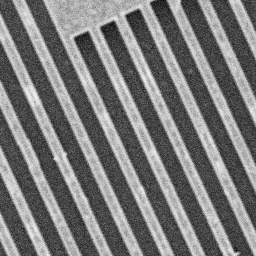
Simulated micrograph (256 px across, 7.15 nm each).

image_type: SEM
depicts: parallel lines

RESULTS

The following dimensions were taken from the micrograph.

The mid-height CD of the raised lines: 9.64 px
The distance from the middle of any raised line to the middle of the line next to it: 200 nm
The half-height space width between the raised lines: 131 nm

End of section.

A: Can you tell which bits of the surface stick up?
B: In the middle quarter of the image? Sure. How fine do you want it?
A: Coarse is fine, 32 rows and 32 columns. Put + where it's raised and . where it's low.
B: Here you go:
...++.....+++.....+++.....++....
...+++.....+++.....++.....+++...
....++.....+++.....+++.....++...
....+++.....++......++.....+++..
.....++.....+++.....+++.....++..
.....+++.....++......++.....+++.
.....+++.....+++.....+++.....++.
+.....++......++.....+++.....+++
+.....+++.....+++.....++......++
++.....++......++.....+++.....++
++.....+++.....+++.....++......+
+++.....++......++.....+++.....+
.++.....+++.....+++.....++.....+
.+++.....++......++.....+++.....
.+++.....+++.....+++.....++.....
..++......++......++.....+++....
..+++.....+++.....+++.....++....
...++......++.....+++.....+++...
...+++.....+++.....++......++...
....++.....+++.....+++.....+++..
....+++.....++......++......++..
.....++.....+++.....+++.....+++.
.....+++.....++......++.....+++.
......++.....+++.....+++.....++.
+.....+++.....++......++.....+++
+......++.....+++.....+++.....++
++.....+++.....++.....+++.....++
++.....+++.....+++.....+++.....+
+++.....++......++.....+++.....+
.++.....+++.....+++.....+++.....
.+++.....++......++.....+++.....
..++.....+++.....+++.....++.....